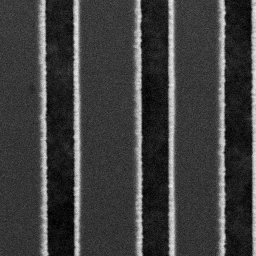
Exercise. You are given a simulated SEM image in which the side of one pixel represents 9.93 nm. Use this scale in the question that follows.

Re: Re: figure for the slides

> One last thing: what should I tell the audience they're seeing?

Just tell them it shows lines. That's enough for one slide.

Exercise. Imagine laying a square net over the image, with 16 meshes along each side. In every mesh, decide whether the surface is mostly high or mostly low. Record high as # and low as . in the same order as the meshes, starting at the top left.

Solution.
###..####..###..
###..####..###..
###..####..###..
###..####..###..
###..####..###..
###..####..###..
###..####..###..
###..####..###..
###..####..###..
###..####..###..
###..####..###..
###..####..###..
###..####..###..
###..####..###..
###..####..###..
###..####..###..